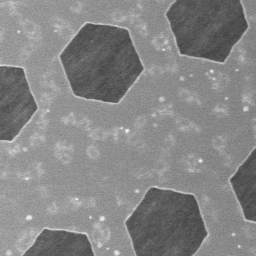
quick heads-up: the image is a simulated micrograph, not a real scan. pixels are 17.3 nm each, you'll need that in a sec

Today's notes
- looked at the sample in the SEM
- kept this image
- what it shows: holes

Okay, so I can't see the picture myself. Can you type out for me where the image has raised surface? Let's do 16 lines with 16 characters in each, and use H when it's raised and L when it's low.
HHHHHHHHHHHLLLLH
HHHHHHHHHHHLLLLH
HHHHLLLLHHHLLLLH
HHHHLLLLLHHHLLHH
LHHHLLLLLHHHHHHH
LLHHLLLLHHHHHHHH
LLHHHHHHHHHHHHHH
LLHHHHHHHHHHHHHH
LHHHHHHHHHHHHHHH
HHHHHHHHHHHHHHHH
HHHHHHHHHHHHHHHL
HHHHHHHHHHHHHHLL
HHHHHHHHHLLLHHHL
HHHHHHHHLLLLLHHL
HHHLLHHHLLLLLHHH
HHLLLLHHLLLLHHHH